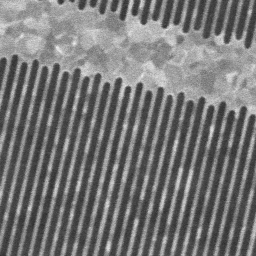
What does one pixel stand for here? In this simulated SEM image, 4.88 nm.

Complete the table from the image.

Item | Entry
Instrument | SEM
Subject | parallel lines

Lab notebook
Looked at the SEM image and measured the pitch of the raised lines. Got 51.9 nm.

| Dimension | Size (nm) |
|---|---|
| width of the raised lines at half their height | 16.1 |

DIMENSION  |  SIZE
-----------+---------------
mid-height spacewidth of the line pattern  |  35.7 nm